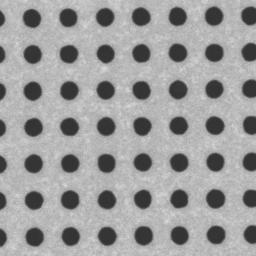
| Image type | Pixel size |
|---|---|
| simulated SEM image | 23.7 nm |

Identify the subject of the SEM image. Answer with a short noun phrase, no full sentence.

a regular array of holes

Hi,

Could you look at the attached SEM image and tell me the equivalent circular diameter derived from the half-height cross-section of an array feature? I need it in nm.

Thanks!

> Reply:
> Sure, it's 452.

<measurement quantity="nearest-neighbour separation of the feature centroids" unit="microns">0.854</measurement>